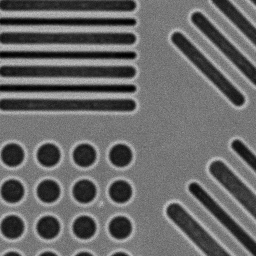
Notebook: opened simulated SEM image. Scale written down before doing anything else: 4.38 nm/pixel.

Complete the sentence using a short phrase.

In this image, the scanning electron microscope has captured groups of lines, slits or small figures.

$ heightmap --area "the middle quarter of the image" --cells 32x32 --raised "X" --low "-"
-----------------XXXXXXXXXXXXXXX
------------------XXXXXXXXXXXXXX
------------------XXXXXXXXXXXXXX
XXXXX------------XXXXXXXXXXXXXXX
XXXXXXXXXXXXXXXXXXXXXXXXXXXXXXXX
------------------XXXXXXXXXXXXXX
------------------XXXXXXXXXXXXXX
XXXXXXXXXXXXXXXXXXXXXXXXXXXXXXXX
XXXXXXXXXXXXXXXXXXXXXXXXXXXXXXXX
------------------XXXXXXXXXXXXXX
------------------XXXXXXXXXXXXXX
------------------XXXXXXXXXXXXXX
XXXXXXXXXXXXXXXXXXXXXXXXXXXXXXXX
XXXXXXXXXXXXXXXXXXXXXXXXXXXXXXXX
XXXXXXXXXXXXXXXXXXXXXXXXXXXXXXXX
XXXXXXXXXXXXXXXXXXXXXXXXXXXXXXXX
XXXXXXXXXXXXXXXXXXXXXXXXXXXXXXXX
XXXXXXXXXXXXXXXXXXXXXXXXXXXXXXXX
XXXXXXXXXXXXXXXXXXXXXXXXXXXXXXXX
XXXXXXXXXXXXXXXXXXXXXXXXXXXXXXXX
XXX----XXXXX----XXXXXXXXXXXXXXXX
XX------XXX------XXXXXXXXXXXXXXX
XX------XXX------XXXXXXXXXXXXXXX
XX------XXX------XXXXXXXXXXXXXXX
XXX-----XXXX-----XXXXXXXXXXXXXXX
XXXX---XXXXXX---XXXXXXXXXXXXXXXX
XXXXXXXXXXXXXXXXXXXXXXXXXXXXXXXX
XXXXXXXXXXXXXXXXXXXXXXXXXXXXXXXX
XXXXXXXXXXXXXXXXXXXXXXXXXXXXXXXX
XXX----XXXXX----XXXXXXXXXXXXXXXX
XX------XXXX-----XXXXXXXXXXXXXX-
XX------XXX------XXXXXXXXXXXXXX-